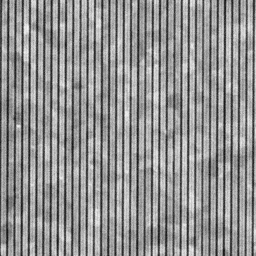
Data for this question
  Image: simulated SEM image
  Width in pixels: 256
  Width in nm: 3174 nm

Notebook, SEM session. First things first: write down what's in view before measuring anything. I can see parallel lines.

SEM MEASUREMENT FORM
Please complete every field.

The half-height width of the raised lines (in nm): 62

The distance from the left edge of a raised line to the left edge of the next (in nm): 89.6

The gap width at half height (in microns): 0.0372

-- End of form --